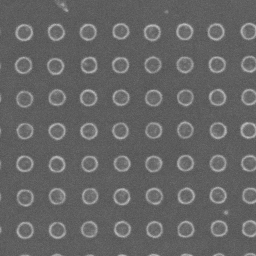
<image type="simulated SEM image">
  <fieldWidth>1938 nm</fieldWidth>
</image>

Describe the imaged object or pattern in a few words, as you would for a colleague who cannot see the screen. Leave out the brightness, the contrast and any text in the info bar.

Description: a regular array of raised bodies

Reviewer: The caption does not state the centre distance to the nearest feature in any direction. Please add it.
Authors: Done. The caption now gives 31.9 px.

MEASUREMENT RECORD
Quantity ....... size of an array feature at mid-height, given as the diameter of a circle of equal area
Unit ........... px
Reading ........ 15.7